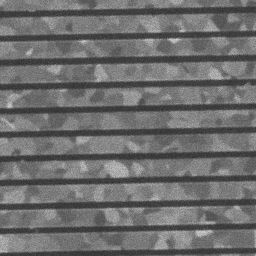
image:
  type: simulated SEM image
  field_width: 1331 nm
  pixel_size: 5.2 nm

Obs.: parallel lines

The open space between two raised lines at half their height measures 36.4 nanometres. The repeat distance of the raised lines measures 125 nanometres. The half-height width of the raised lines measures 87.7 nm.